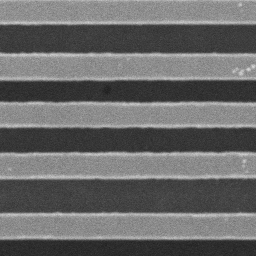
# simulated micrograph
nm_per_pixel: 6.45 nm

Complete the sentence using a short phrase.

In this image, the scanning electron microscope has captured lines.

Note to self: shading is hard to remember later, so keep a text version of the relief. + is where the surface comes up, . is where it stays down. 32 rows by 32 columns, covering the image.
++++++++++++++++++++++++++++++++
++++++++++++++++++++++++++++++++
++++++++++++++++++++++++++++++++
................................
................................
................................
................................
++++++++++++++++++++++++++++++++
++++++++++++++++++++++++++++++++
++++++++++++++++++++++++++++++++
................................
................................
................................
++++++++++++++++++++++++++++++++
++++++++++++++++++++++++++++++++
++++++++++++++++++++++++++++++++
................................
................................
................................
++++++++++++++++++++++++++++++++
++++++++++++++++++++++++++++++++
++++++++++++++++++++++++++++++++
................................
................................
................................
................................
................................
++++++++++++++++++++++++++++++++
++++++++++++++++++++++++++++++++
++++++++++++++++++++++++++++++++
................................
................................